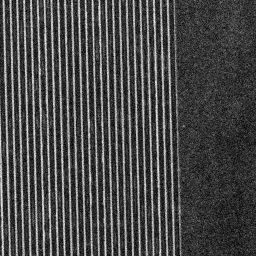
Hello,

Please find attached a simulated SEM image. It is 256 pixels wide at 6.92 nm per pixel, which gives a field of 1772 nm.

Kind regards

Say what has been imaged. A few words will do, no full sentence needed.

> parallel lines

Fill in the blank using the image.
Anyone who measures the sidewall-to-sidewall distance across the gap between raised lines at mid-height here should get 38.9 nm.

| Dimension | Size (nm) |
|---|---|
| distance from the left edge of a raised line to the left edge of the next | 47.3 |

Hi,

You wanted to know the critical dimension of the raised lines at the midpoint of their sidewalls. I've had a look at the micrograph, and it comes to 8.6 nm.